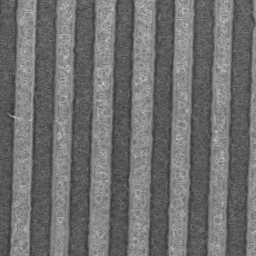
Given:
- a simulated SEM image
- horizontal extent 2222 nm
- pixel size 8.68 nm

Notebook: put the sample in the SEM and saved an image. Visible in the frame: parallel lines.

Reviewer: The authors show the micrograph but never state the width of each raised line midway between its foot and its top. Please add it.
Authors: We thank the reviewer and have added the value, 17.5 pixels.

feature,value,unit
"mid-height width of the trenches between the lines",184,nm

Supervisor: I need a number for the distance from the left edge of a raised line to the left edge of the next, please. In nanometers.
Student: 342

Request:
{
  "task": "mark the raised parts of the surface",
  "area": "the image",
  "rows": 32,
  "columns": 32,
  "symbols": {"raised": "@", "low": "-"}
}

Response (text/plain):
--@@---@@---@@---@@---@@---@@---
--@@---@@---@@---@@---@@---@@---
--@@---@@---@@---@@---@@---@@---
--@@---@@---@@---@@---@@---@@---
--@@---@@---@@---@@---@@---@@---
--@@---@@---@@---@@---@@---@@---
--@@---@@---@@---@@---@@---@@---
--@@---@@---@@---@@---@@---@@---
--@@---@@---@@---@@---@@---@@---
--@@---@@---@@---@@---@@---@@---
--@@---@@---@@---@@---@@---@@--@
--@@---@@---@@---@@---@@---@@---
--@@---@@---@@---@@---@@---@@--@
--@@---@@---@@---@@---@@---@@--@
--@@---@@---@@---@@---@@---@@--@
--@@---@@---@@--@@@---@@---@@--@
--@@---@@---@@---@@---@@---@@--@
--@@---@@---@@--@@@--@@@---@@--@
--@@---@@---@@--@@@--@@@---@---@
--@@---@@---@@--@@@--@@@--@@---@
--@@---@@--@@@--@@@--@@@--@@---@
--@@---@@--@@@--@@@--@@@--@@---@
--@@---@@--@@@--@@@--@@@--@@---@
--@@---@@--@@@--@@@--@@@--@@---@
--@@---@@--@@@--@@@--@@---@@---@
--@@---@@--@@@--@@@--@@---@@---@
--@@---@@--@@@--@@@--@@---@@---@
--@@---@---@@@--@@@--@@---@@---@
-@@@---@---@@@--@@@--@@---@@---@
-@@@--@@---@@@--@@---@@---@@---@
-@@@--@@---@@@--@@---@@---@@---@
-@@@--@@---@@---@@---@@---@@---@